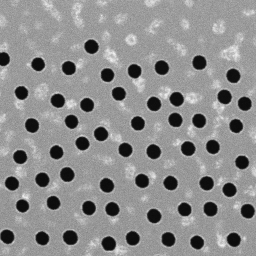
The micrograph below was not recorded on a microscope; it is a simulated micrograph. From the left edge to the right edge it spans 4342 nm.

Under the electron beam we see a regular array of holes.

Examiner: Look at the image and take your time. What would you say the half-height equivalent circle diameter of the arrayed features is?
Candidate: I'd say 250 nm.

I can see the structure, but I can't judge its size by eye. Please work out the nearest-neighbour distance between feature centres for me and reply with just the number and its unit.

420 nanometres